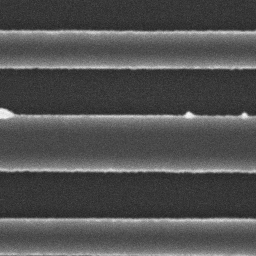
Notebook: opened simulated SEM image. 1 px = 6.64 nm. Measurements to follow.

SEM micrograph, lines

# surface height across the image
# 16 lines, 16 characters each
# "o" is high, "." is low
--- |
................
................
oooooooooooooooo
oooooooooooooooo
................
................
................
oooooooooooooooo
oooooooooooooooo
oooooooooooooooo
oooooooooooooooo
................
................
................
oooooooooooooooo
oooooooooooooooo